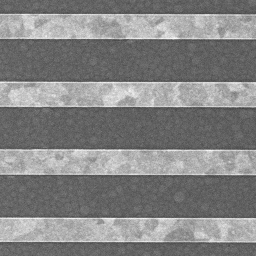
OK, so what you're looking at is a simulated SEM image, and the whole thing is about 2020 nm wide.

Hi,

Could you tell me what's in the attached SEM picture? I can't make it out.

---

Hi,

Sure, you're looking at one or a few lines or trenches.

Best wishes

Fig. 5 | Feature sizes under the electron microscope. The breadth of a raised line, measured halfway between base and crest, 188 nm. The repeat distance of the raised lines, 535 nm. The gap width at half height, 342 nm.